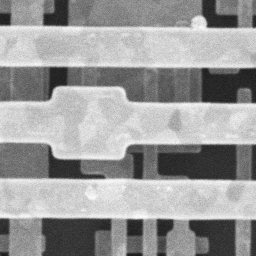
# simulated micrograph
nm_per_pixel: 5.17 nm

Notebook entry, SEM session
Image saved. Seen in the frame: wiring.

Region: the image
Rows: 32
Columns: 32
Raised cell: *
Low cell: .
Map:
................................
................................
........................**......
**************************......
********************************
********************************
********************************
********************************
................................
................................
................................
.......*********................
......**********................
********************************
********************************
********************************
********************************
********************************
......**********................
.......********.................
................................
................................
******************..............
********************************
********************************
********************************
********************************
................................
................................
................................
................................
................................